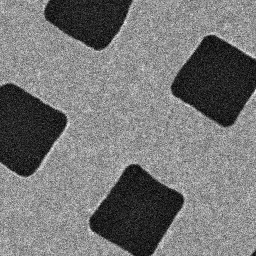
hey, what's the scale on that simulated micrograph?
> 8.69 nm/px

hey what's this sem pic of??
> holes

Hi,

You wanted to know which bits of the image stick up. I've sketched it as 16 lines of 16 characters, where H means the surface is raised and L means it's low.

HHHLLLLLHHHHHHHH
HHHLLLLLHHHHHHHH
HHHHHLLHHHHHHLHH
HHHHHHHHHHHHLLLL
HHHHHHHHHHHLLLLL
LHHHHHHHHHHLLLLL
LLLHHHHHHHHHLLLH
LLLLHHHHHHHHHLLH
LLLLHHHHHHHHHHHH
LLLHHHHHHHHHHHHH
LLHHHHHHLHHHHHHH
HHHHHHHLLLHHHHHH
HHHHHHLLLLLHHHHH
HHHHHHLLLLLHHHHH
HHHHHHLLLLHHHHHH
HHHHHHHHLLHHHHHH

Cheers